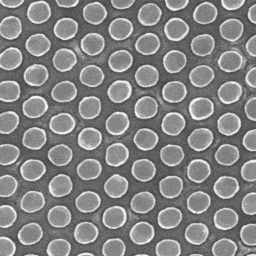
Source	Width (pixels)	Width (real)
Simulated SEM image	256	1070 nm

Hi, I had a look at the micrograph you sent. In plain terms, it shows a regular array of raised bodies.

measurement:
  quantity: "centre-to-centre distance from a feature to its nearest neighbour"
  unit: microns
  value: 0.128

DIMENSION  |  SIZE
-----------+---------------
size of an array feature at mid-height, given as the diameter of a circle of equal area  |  94 nanometers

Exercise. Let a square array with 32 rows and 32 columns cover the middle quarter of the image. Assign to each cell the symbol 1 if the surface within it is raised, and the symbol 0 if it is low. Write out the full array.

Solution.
11000011000011110000110001111100
10000111100011100011111000111000
00001111110000000011111100000000
00001111110000000011111100000001
10001111100001100011111000010000
11100011000011110001100001111100
11100000000111111000000001111100
11100000000111110000000001111100
11000111000011110000110001111100
00001111100001000011111000010000
00001111100000000011111000000000
00001111100000000011111000000000
00001111100011100011111000011000
11000110000111110001100001111100
11100000000111110000000001111100
11000000000111110000000001111100
11000111000111100001100001111000
00001111100011000011111000111000
00001111100000000011111000000001
00001111100000000011111000000001
10001111000011100001111001110001
11000000000111110000000011111100
11000000000111110000000011111100
11000000000111110000000011111100
10000111100111100011110001111000
00001111100000000111111000000001
00011111100000000111111000000001
00001111100000000111111000000001
10001111000111100011110001111001
11000000000111110000000011111100
11000000001111110000000011111100
11000000001111110000000011111000